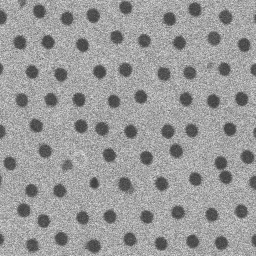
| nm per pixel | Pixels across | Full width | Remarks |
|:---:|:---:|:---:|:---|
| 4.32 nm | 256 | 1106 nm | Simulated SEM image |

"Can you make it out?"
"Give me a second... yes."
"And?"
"a regular array of holes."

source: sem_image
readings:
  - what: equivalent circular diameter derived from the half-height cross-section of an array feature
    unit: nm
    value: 57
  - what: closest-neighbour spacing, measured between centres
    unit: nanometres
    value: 118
